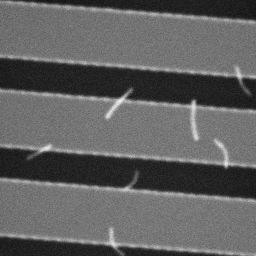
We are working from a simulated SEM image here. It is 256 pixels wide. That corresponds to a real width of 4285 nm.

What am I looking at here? lines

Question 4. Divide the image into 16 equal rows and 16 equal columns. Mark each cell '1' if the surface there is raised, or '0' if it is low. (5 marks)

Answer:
1111110000000000
1111111111111111
1111111111111111
1111111111111111
0000000000011111
0000000000000000
1111111111100000
1111111111111111
1111111111111111
0000111111111111
0000000000000000
1111000000000000
1111111111111111
1111111111111111
1111111111111111
0000000001111111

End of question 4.